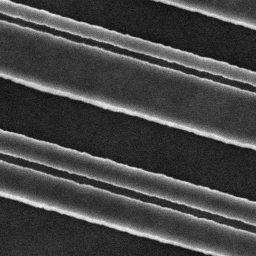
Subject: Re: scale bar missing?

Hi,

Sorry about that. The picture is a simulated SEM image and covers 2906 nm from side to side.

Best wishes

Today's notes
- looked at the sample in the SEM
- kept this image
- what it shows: lines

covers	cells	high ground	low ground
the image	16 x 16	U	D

UUDDDDDDDDDDUUUU
UUUUUDDDDDDDDDDU
UUUUUUUUUDDDDDDD
UUUUUUUUUUUUDDDD
UUUUUUUUUUUUUUUU
DDDUUUUUUUUUUUUU
DDDDDDUUUUUUUUUU
DDDDDDDDDDUUUUUU
UDDDDDDDDDDDDUUU
UUUUUDDDDDDDDDDD
UUUUUUUUDDDDDDDD
UUUUUUUUUUUUDDDD
DUUUUUUUUUUUUUUD
DDDDDUUUUUUUUUUU
DDDDDDDDUUUUUUUU
DDDDDDDDDDDDUUUU